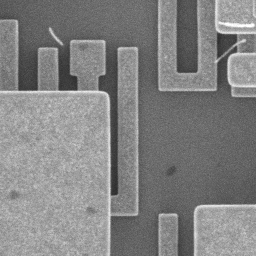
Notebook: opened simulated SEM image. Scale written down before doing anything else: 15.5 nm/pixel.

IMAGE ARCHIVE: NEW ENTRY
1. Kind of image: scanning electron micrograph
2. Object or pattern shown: wiring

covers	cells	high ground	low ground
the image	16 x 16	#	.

..............##
..............##
................
...............#
..............##
................
#######.........
#######.........
#######.........
#######.........
#######.........
#######.........
#######.........
#######.....####
#######.....####
#######.....####